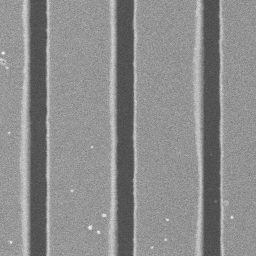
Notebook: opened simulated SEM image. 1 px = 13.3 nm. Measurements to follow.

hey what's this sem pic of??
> lines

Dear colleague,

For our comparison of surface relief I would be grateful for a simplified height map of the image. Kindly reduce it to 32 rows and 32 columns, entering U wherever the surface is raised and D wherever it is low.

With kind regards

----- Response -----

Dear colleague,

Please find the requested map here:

UUUUDDUUUUUUUUDDDUUUUUUUUDDUUUUU
UUUUDDUUUUUUUUDDDUUUUUUUUDDUUUUU
UUUUDDUUUUUUUUDDDUUUUUUUUDDUUUUU
UUUUDDUUUUUUUUDDDUUUUUUUUDDUUUUU
UUUUDDUUUUUUUUDDDUUUUUUUUDDUUUUU
UUUUDDUUUUUUUUDDDUUUUUUUUDDUUUUU
UUUUDDUUUUUUUUDDDUUUUUUUUDDUUUUU
UUUUDDUUUUUUUUDDDUUUUUUUUDDDUUUU
UUUUDDUUUUUUUUDDDUUUUUUUUDDDUUUU
UUUUDDUUUUUUUUDDDUUUUUUUUDDUUUUU
UUUUDDUUUUUUUUDDDUUUUUUUUDDUUUUU
UUUUDDUUUUUUUUDDDUUUUUUUUDDUUUUU
UUUUDDUUUUUUUUDDDUUUUUUUUDDUUUUU
UUUDDDUUUUUUUUDDDUUUUUUUUDDDUUUU
UUUDDDUUUUUUUUDDDUUUUUUUUDDDUUUU
UUUDDDUUUUUUUUDDDUUUUUUUUDDUUUUU
UUUDDDUUUUUUUUUDDUUUUUUUUDDUUUUU
UUUDDDUUUUUUUUUDDUUUUUUUUDDUUUUU
UUUDDDUUUUUUUUUDDUUUUUUUUDDDUUUU
UUUDDDUUUUUUUUDDDUUUUUUUUDDDUUUU
UUUDDDUUUUUUUUDDDUUUUUUUUDDDUUUU
UUUDDDUUUUUUUUUDDUUUUUUUUDDDUUUU
UUUUDDUUUUUUUUDDDUUUUUUUUDDDUUUU
UUUUDDUUUUUUUUDDDUUUUUUUUDDDUUUU
UUUDDDUUUUUUUUUDDUUUUUUUUDDDUUUU
UUUUDDUUUUUUUUUDDUUUUUUUUDDDUUUU
UUUUDDUUUUUUUUUDDUUUUUUUUDDDUUUU
UUUUDDUUUUUUUUDDDUUUUUUUUDDDUUUU
UUUUDDUUUUUUUUDDDUUUUUUUUDDDUUUU
UUUUDDUUUUUUUUDDDUUUUUUUUDDDUUUU
UUUUDDUUUUUUUUDDDUUUUUUUUDDDUUUU
UUUUDDUUUUUUUUDDDUUUUUUUUDDDUUUU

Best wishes